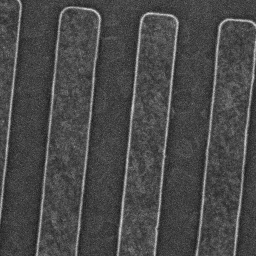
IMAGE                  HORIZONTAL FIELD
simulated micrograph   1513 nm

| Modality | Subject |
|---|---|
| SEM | one or a few lines or trenches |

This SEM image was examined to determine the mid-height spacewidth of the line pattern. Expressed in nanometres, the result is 249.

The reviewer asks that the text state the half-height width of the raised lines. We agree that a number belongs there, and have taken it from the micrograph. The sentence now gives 0.221 micrometres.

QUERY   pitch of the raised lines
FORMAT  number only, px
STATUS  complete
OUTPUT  79.2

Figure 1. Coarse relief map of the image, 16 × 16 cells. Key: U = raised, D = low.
UDDDUDDDDDDDDDDD
UDDDUUDDDUUDDDUU
UDDDUUDDDUUDDDUU
UDDDUUDDDUUDDDUU
UDDUUUDDUUUDDUUU
UDDUUUDDUUUDDUUU
UDDUUUDDUUUDDUUU
UDDUUUDDUUUDDUUD
UDDUUDDDUUDDDUUD
DDDUUDDDUUDDDUUD
DDDUUDDDUUDDDUUD
DDDUUDDDUUDDDUUD
DDDUUDDDUUDDDUUD
DDDUUDDDUUDDDUUD
DDUUUDDDUUDDUUUD
DDUUUDDUUUDDUUUD